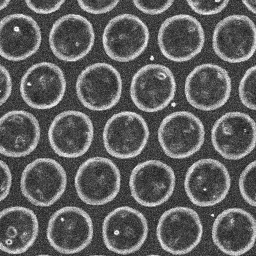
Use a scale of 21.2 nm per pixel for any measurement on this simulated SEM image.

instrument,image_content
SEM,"a regular array of raised bodies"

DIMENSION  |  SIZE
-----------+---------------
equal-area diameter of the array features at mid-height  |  905 nm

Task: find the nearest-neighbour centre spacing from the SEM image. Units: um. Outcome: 1.15